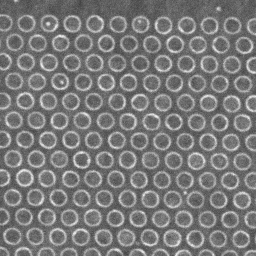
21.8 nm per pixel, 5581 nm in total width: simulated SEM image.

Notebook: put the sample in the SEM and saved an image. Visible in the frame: a regular array of raised bodies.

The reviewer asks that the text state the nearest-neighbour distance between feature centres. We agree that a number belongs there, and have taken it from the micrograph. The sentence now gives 485 nanometers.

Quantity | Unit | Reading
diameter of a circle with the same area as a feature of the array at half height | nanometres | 352